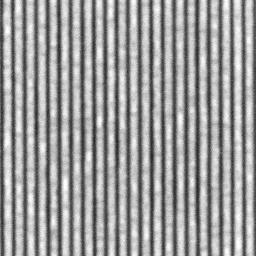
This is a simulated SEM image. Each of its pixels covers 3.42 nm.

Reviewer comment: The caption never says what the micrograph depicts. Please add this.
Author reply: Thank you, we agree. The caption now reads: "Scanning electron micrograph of parallel lines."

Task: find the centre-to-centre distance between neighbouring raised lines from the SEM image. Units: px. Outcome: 11.5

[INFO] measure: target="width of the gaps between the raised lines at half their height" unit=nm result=12.4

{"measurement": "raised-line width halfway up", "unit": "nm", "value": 27.8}